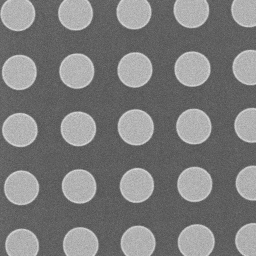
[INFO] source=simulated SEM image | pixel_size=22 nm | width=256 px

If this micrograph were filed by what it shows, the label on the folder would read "an array of small figures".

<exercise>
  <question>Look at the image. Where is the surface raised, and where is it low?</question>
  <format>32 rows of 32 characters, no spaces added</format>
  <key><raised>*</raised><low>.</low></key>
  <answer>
.***....***....****...****...***
****...*****...****...****...***
****....***....****...****...***
.**.....**......**..............
................................
................................
..............................**
.***....***....****...****...***
****....****...****...****...***
****....****...****...****...***
.***....***.....**.....**......*
................................
................................
................................
.***....***....****....***....**
****....****...****...****...***
*****...****...****...****....**
.***....***....****....***....**
................................
................................
................................
..*......**.....**.....***....**
.****...****...****...****....**
.****...****...****...****....**
.****...****...****....***....**
..*.............................
................................
................................
..........*.....**.....***....**
.***....****...****...*****...**
.****...****...****...*****..***
.****...****...****....***....**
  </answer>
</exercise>